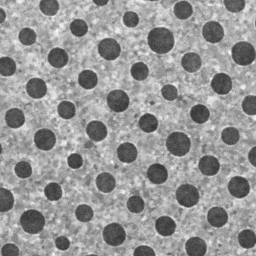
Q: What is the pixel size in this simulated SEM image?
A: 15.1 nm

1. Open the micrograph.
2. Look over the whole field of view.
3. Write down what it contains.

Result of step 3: a regular array of holes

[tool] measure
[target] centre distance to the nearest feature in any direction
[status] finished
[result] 0.553 um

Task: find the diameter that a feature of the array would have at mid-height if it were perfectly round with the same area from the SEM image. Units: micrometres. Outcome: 0.325